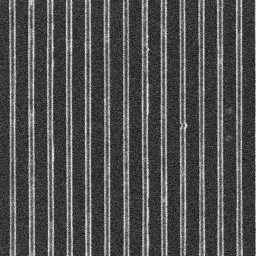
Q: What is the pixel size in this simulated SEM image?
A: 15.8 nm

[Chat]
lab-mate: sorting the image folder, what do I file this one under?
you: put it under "parallel lines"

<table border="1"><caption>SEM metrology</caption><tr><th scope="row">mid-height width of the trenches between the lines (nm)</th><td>216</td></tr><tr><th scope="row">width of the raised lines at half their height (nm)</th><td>83.1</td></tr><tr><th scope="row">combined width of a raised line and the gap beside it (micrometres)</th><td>0.299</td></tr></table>